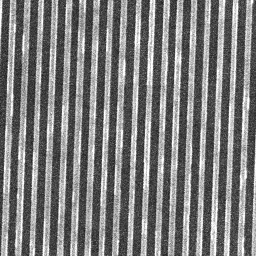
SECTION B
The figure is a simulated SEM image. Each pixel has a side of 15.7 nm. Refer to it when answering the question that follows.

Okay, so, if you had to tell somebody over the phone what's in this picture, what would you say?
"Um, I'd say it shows parallel lines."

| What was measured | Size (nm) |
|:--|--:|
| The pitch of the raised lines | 218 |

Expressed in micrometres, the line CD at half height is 0.0883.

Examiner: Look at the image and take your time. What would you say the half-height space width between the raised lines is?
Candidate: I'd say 134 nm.